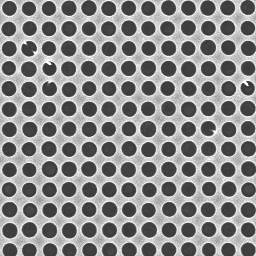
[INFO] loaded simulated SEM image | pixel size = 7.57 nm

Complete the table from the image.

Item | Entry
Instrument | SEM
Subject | a regular array of holes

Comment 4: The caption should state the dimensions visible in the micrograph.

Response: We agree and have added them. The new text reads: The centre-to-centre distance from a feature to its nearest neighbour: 0.148 microns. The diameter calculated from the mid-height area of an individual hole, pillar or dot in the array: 111 nm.